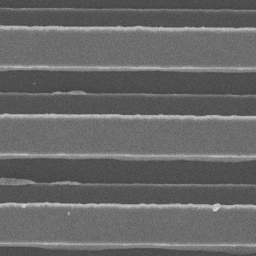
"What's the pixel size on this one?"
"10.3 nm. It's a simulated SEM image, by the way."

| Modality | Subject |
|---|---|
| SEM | lines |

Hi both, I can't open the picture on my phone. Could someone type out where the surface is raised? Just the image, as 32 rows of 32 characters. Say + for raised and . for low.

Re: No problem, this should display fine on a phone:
................................
................................
................................
+++++++++++++++++++.+..+.+......
++++++++++++++++++++++++++++++++
++++++++++++++++++++++++++++++++
++++++++++++++++++++++++++++++++
++++++++++++++++++++++++++++++++
............++++++++++++++++++++
................................
................................
................................
................................
................................
++++++++++++++++++++++++++++.+..
++++++++++++++++++++++++++++++++
++++++++++++++++++++++++++++++++
++++++++++++++++++++++++++++++++
++++++++++++++++++++++++++++++++
..........................++++++
................................
................................
................................
................................
................................
++++++++........................
++++++++++++++++++++++++++++++++
++++++++++++++++++++++++++++++++
++++++++++++++++++++++++++++++++
++++++++++++++++++++++++++++++++
.....+++++++++++++++++++++++++++
................................